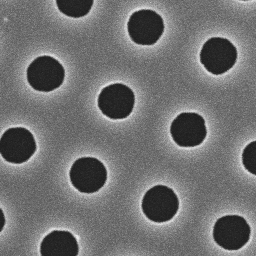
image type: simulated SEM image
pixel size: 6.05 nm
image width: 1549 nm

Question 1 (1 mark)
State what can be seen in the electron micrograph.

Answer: a regular array of holes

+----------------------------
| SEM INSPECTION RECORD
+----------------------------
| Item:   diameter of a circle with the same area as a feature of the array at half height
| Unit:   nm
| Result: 224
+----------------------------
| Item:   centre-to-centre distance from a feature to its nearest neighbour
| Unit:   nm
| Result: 466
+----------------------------